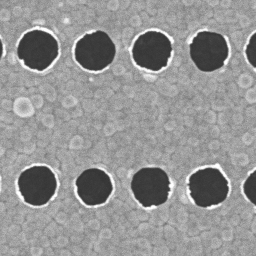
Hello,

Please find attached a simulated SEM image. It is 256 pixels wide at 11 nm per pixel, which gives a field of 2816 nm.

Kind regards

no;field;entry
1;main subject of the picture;a regular array of holes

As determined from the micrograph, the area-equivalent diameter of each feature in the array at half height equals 440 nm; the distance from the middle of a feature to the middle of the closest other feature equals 625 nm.